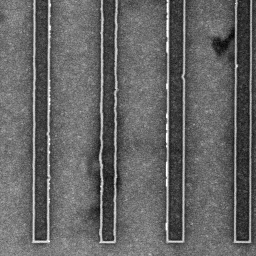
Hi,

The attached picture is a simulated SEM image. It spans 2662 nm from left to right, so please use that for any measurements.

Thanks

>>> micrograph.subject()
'one or a few lines or trenches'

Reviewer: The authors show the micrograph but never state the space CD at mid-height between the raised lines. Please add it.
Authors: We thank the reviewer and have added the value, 52 pixels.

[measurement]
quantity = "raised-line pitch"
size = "699 nm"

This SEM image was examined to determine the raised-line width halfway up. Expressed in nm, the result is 152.